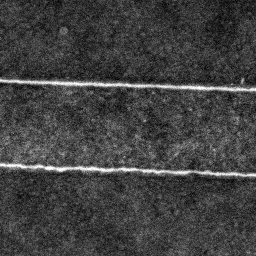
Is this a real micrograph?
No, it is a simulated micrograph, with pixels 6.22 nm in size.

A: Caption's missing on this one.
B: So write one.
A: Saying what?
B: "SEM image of one or a few lines or trenches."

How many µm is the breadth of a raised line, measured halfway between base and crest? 0.531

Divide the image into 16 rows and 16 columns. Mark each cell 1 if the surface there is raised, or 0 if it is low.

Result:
0000000000000000
0000000000000000
0000000000000000
0000000000000000
0000000000000000
1111111111110000
1111111111111111
1111111111111111
1111111111111111
1111111111111111
0001111111111111
0000000000000000
0000000000000000
0000000000000000
0000000000000000
0000000000000000